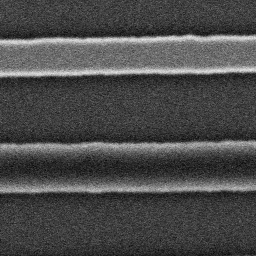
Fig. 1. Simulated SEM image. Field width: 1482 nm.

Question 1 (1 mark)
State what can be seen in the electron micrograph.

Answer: lines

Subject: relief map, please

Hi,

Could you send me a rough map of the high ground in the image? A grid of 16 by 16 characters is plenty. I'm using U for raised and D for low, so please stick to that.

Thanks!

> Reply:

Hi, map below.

DDDDDDDDDDDDDDDD
DDDDDDDDDDDDDDDD
DDUUUUUUUUUUUUUU
UUUUUUUUUUUUUUUU
UUUUUUUUUUUUUUDD
DDDDDDDDDDDDDDDD
DDDDDDDDDDDDDDDD
DDDDDDDDDDDDDDDD
DDDDDDDDDDDDDDDD
UUUUUUUUUUUUUUUU
UUUUUUUUUUUUUUUU
UUUUUUUUUUUUUUUU
DDDDDDDDDDDDDDDD
DDDDDDDDDDDDDDDD
DDDDDDDDDDDDDDDD
DDDDDDDDDDDDDDDD